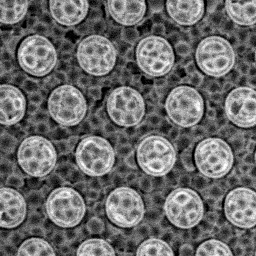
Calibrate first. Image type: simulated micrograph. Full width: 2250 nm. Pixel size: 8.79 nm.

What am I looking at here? a regular array of raised bodies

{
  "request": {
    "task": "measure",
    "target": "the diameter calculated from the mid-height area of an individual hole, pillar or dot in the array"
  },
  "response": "0.337 micrometres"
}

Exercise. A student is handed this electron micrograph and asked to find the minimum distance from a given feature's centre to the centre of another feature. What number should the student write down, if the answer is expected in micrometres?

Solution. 0.511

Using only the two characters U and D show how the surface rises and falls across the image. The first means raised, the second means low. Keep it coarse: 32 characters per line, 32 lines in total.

UUUDDDUUUUUDDUUUUUDDDUUUUUDDUUUU
UUUDDDUUUUUDDDUUUUDDDUUUUDDDUUUU
UUDDDDDUUUDDDDUUUDDDDDUUUDDDDUUU
DDDDDDDDDDDDDDDDDDDDDDDDDDDDDDDD
DDDDDDDDDDDDDDDDDDDDDDDDDDDDDDDD
DDDUUUDDDDUUUUDDDUUUUDDDDUUUUDDD
DDUUUUUDDDUUUUDDDUUUUUDDDUUUUDDD
DDUUUUUDDDUUUUDDDUUUUUDDDUUUUDDD
DDDUUUUDDDUUUUDDDDUUUDDDDUUUUDDD
DDDDDDDDDDDDDDDDDDDDDDDDDDDDDDDD
DDDDDDDDDDDDDDDDDDDDDDDDDDDDDDDD
UUDDDDDUUUDDDDUUUDDDDDUUUDDDDUUU
UUUDDDUUUUUDDDUUUUDDDUUUUDDDUUUU
UUUDDDUUUUUDDUUUUUDDDUUUUDDDUUUU
UUUDDDDUUUDDDDUUUUDDDUUUUDDDDUUU
UUDDDDDDUDDDDDDUUDDDDDUUDDDDDUUU
DDDDDDDDDDDDDDDDDDDDDDDDDDDDDDDD
DDDUUUDDDDDUUDDDDDUUUDDDDDUUDDDD
DDDUUUUDDDUUUUDDDUUUUUDDDUUUUDDD
DDUUUUUDDDUUUUDDDUUUUUDDUUUUUDDD
DDDUUUUDDDUUUUDDDUUUUUDDDUUUUDDD
DDDUUUDDDDDUUDDDDDUUUDDDDUUUDDDD
DDDDDDDDDDDDDDDDDDDDDDDDDDDDDDDD
DDDDDDDDDDDDDDDDDDDDDDDDDDDDDDDD
UUUDDDUUUUDDDDUUUDDDDUUUUDDDUUUU
UUUDDDUUUUDDDUUUUUDDDUUUUDDDUUUU
UUUDDDUUUUDDDUUUUUDDDUUUUDDDUUUU
UUUDDDDUUUDDDDUUUUDDDUUUUDDDDUUU
DDDDDDDDDDDDDDDDDDDDDDDDDDDDDDDD
DDDDDDDDDDDDDDDDDDDDDDDDDDDDDDDD
DDDUUUDDDDUUUDDDDDUUUDDDDUUUDDDD
DDUUUUUDDDUUUUDDDUUUUDDDDUUUUDDD